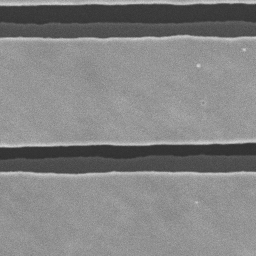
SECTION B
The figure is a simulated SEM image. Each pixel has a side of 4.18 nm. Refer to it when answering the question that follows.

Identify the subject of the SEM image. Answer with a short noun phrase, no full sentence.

lines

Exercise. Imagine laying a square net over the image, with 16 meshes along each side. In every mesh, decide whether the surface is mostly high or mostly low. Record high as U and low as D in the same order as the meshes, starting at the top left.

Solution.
DDDDDDDDDDDDDDDD
DDDDDDDDDDDDDDDD
UUUUUUUUUUUUUUUU
UUUUUUUUUUUUUUUU
UUUUUUUUUUUUUUUU
UUUUUUUUUUUUUUUU
UUUUUUUUUUUUUUUU
UUUUUUUUUUUUUUUU
UUUUUUUUUUUUUUUU
DDDDDDDDDDDDDDDD
DDDDDDDDDDDDDDDD
UUUUUUUUUUUUUUUU
UUUUUUUUUUUUUUUU
UUUUUUUUUUUUUUUU
UUUUUUUUUUUUUUUU
UUUUUUUUUUUUUUUU